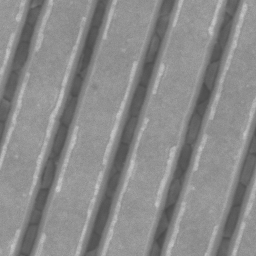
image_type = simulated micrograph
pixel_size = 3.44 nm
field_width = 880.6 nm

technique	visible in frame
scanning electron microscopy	one or a few lines or trenches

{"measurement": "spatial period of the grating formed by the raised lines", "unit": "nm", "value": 215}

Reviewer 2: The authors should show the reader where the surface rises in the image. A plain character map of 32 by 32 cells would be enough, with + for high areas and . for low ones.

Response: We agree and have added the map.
+++...+++++...++++++..++++++..++
+++...+++++...+++++...+++++...++
+++..++++++..++++++...+++++...++
++...++++++..++++++..++++++..+++
++...+++++...+++++...++++++..+++
++..++++++..++++++...+++++...+++
+...++++++..++++++..++++++...+++
+...+++++...+++++...++++++..++++
+..++++++...+++++...+++++...++++
...++++++..++++++..++++++...++++
...+++++...++++++..++++++..+++++
..++++++...+++++...+++++...+++++
..++++++..++++++...+++++...+++++
..+++++...++++++..++++++..++++++
.++++++...+++++...+++++...++++++
.++++++..++++++...+++++...+++++.
.++++++..++++++..++++++..++++++.
.+++++...+++++...++++++..++++++.
++++++..++++++...+++++...++++++.
++++++..++++++..++++++..++++++..
+++++...+++++...++++++..++++++..
+++++..++++++...+++++...++++++..
+++++..++++++..++++++...+++++...
++++...++++++..++++++..++++++..+
++++...+++++...+++++...++++++..+
++++..++++++...+++++...+++++...+
+++...++++++..++++++..++++++...+
+++...+++++...+++++...++++++..++
+++..++++++...+++++...++++++..++
++...++++++..++++++..++++++...++
++...+++++...+++++...++++++..+++
++..++++++...+++++...++++++..+++